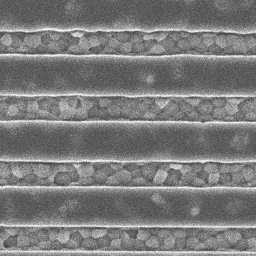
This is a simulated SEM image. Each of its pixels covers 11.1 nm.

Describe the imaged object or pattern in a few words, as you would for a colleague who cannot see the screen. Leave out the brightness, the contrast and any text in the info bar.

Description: one or a few lines or trenches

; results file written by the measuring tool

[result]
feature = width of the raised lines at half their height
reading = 40.4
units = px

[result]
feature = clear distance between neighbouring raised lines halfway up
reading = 0.274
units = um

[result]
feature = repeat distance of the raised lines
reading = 731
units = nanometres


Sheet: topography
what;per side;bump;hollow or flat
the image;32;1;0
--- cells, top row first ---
11111111111111111111111111111111
11111111111111111111111111111111
11111111111111111111111111111111
11111111111111111111111111111111
00000000000000000000000000000000
00000000000000000000000000000000
00000000000000000000000000000000
11111111111111111111111111111111
11111111111111111111111111111111
11111111111111111111111111111111
11111111111111111111111111111111
11111111111111111111111111111111
00000000000000000000000000000000
00000000000000000000000000000000
00000000000000000000000000000000
11111111111111111111111111111111
11111111111111111111111111111111
11111111111111111111111111111111
11111111111111111111111111111111
11111111111111111111111111111111
00000000000000000000000000000000
00000000000000000000000000000000
00000000000000000000000000000000
11111111111111110111111100111111
11111111111111111111111111111111
11111111111111111111111111111111
11111111111111111111111111111111
11111111111111111111111111111111
00000000000000000000000000000000
00000000000000000000000000000000
00000000000000000000000000000000
11111111111110000000000000000000